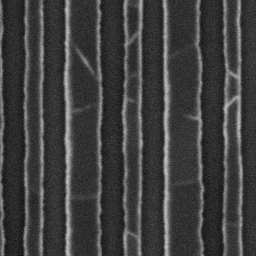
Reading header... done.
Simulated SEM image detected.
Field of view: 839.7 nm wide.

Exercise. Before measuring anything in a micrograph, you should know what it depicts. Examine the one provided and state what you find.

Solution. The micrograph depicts lines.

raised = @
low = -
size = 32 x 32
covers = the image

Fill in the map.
---@@---@@@@----@@--@@@@@---@@--
---@@---@@@@----@@---@@@@---@@--
---@@---@@@@----@@---@@@@---@@--
---@@---@@@@----@@---@@@@---@@--
---@@---@@@@----@@---@@@@---@@--
---@@---@@@@----@@---@@@@---@@--
---@@---@@@@----@@---@@@@---@@--
---@@---@@@@----@@---@@@@---@@--
---@@---@@@@@---@@---@@@@---@@--
---@@---@@@@@---@@---@@@@---@@--
---@@---@@@@@---@@---@@@@---@@--
---@@---@@@@@---@@---@@@@---@@--
---@@---@@@@@---@@---@@@@---@@--
---@@---@@@@@--@@@---@@@@---@@--
---@@---@@@@@--@@@---@@@@---@@--
---@@---@@@@@--@@@---@@@@---@@--
---@@---@@@@----@@---@@@@---@@--
---@@---@@@@@--@@@---@@@@---@@--
---@@---@@@@@--@@@---@@@@---@@--
---@@---@@@@@---@@---@@@@---@@--
---@@---@@@@@---@@---@@@@---@@--
---@@---@@@@@---@@---@@@@---@@--
---@@---@@@@@---@@---@@@@---@@--
---@@---@@@@@---@@---@@@@---@@--
---@@---@@@@@---@@---@@@@---@@--
---@@---@@@@----@@---@@@@---@@--
---@@---@@@@@---@----@@@@---@@--
---@@---@@@@----@----@@@@---@@--
---@@---@@@@@---@----@@@@---@@--
@--@@---@@@@@---@----@@@@---@@--
@--@@---@@@@----@----@@@@---@@--
---@@---@@@@@---@@---@@@@---@@--